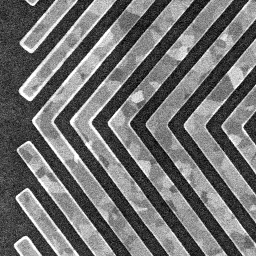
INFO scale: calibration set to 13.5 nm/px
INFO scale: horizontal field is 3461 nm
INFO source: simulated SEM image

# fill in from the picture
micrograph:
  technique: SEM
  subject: groups of lines, slits or small figures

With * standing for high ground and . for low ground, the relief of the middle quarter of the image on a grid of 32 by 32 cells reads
....*****....******....*****....
...*****....******....*****.....
..*****.....*****....******....*
.*****.....*****....******....**
*****.....*****....******....***
****.....*****.....*****....****
****....*****.....*****....*****
***....******....*****....******
**.....*****....******....*****.
*.....*****....******....*****..
.....*****....******....******..
....*****.....*****....******...
...*****.....*****....******....
..*****.....*****.....*****....*
..*****....*****.....*****....**
..*****....*****.....*****....**
...*****....*****....*****.....*
....****.....*****....*****....*
.....****.....*****....*****....
*....*****....*****....******...
**....*****....*****....*****...
**.....****.....*****....*****..
***....*****.....*****....*****.
****....*****....*****.....*****
****.....*****....*****....*****
*****.....*****....*****....****
.*****....*****....******....***
..*****....*****....*****.....**
...*****....*****....*****....**
....****.....*****....*****....*
....*****....******....*****....
*....*****....*****....*****....